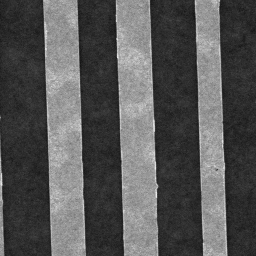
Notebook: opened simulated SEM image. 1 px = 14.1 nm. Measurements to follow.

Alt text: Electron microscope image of one or a few lines or trenches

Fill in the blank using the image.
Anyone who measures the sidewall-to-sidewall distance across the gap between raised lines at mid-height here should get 0.643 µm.